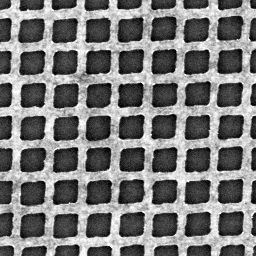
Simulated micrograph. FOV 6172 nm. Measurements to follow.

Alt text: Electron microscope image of a regular array of holes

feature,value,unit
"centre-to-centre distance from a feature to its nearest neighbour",771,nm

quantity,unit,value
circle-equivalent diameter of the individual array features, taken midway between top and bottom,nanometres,665